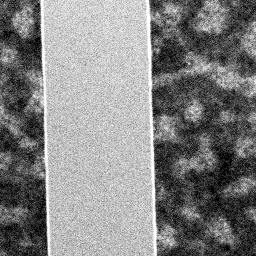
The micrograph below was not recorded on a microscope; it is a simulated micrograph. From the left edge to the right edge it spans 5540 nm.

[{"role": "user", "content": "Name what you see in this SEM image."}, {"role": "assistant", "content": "one or a few lines or trenches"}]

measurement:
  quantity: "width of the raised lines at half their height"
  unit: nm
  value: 2310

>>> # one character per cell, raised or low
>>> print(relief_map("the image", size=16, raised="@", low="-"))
---@@@@@@-------
---@@@@@@-------
---@@@@@@-------
---@@@@@@-------
---@@@@@@-------
---@@@@@@-------
---@@@@@@-------
---@@@@@@-------
---@@@@@@-------
---@@@@@@@------
---@@@@@@@------
---@@@@@@@------
---@@@@@@@------
---@@@@@@@------
---@@@@@@@------
---@@@@@@@------